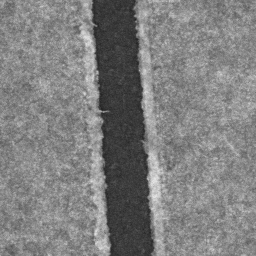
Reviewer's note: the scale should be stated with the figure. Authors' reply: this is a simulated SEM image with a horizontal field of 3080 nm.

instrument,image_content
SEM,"one or a few lines or trenches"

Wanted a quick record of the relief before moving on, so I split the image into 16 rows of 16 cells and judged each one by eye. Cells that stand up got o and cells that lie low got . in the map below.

ooooo....ooooooo
ooooo....ooooooo
oooooo...ooooooo
oooooo...ooooooo
oooooo...ooooooo
oooooo...ooooooo
oooooo...ooooooo
oooooo...ooooooo
oooooo...ooooooo
oooooo....oooooo
oooooo....oooooo
oooooo....oooooo
oooooo....oooooo
oooooo....oooooo
oooooo....oooooo
oooooo....oooooo